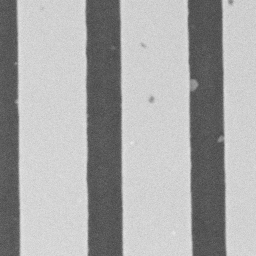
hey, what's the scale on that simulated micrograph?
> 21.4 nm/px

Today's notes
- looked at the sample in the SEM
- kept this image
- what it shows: lines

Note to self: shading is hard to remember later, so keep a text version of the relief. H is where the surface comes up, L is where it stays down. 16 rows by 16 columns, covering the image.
LHHHHLLLHHHHLLHH
LHHHHLLLHHHHLLHH
LHHHHLLLHHHHLLHH
LHHHHLLLHHHHLLHH
LHHHHLLLHHHHLLHH
LHHHHLLLHHHHLLHH
LHHHHLLLHHHHLLHH
LHHHHLLLHHHHLLHH
LHHHHLLLHHHHLLHH
LHHHHLLLHHHHLLHH
LHHHHLLLHHHHLLHH
LHHHHLLLHHHHLLHH
LHHHHLLLHHHHLLHH
LHHHHLLLHHHHLLHH
LHHHHLLLHHHHLLHH
LHHHHLLLHHHHLLHH